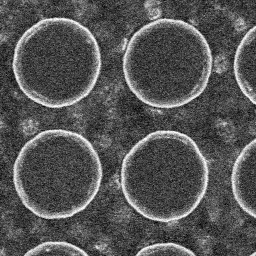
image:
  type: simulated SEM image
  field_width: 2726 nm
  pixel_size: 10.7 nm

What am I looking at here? raised bodies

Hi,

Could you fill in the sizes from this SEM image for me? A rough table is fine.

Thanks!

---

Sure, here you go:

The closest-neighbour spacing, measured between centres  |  1.16 microns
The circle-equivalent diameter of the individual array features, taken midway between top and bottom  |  910 nm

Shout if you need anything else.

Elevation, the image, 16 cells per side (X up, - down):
----------------
--XXX----XXX----
-XXXXX--XXXXX--X
-XXXXX--XXXXX--X
-XXXXX--XXXXX--X
-XXXXX--XXXXX--X
---X-----XX-----
----------------
--XXX----XXX----
-XXXXX--XXXX---X
-XXXXX--XXXXX--X
-XXXXX--XXXXX--X
-XXXXX--XXXX---X
---X-----XX-----
----------------
--XXX----XX-----